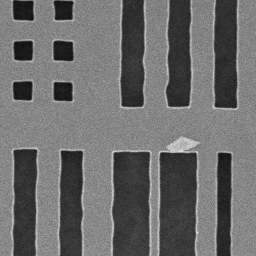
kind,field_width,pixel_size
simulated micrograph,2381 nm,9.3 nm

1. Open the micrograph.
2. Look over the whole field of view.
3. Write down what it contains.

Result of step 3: groups of lines, slits or small figures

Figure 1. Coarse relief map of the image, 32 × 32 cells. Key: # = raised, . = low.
##..###..######...###...###...##
##..###..######...###...###...##
##..###..######...###...###...##
###############...###...###...##
###############...###...###...##
##..###..######...###...###...##
##..###..######...###...###...##
##..###..######...###...###...##
###############...###...###...##
###############...###...###...##
##..###..######...###...###...##
##..###..######...###...###...##
##..###..######...###...###...##
################.##########..###
################################
################################
################################
################################
################################
##...###..####.....#.....##..###
##...###..####.....#.....##..###
##...###..####.....#.....##..###
##...##...####.....#.....##..###
##...##...####.....#.....##..###
##...##...####.....#.....##..###
##...##...####.....#.....##..###
##...##...####.....#.....##..###
##...##...####.....#.....##..###
##...##...####.....#.....##..###
##...##...####.....#.....##..###
##...##...####.....#....###..###
##...##...####.....#....###..###